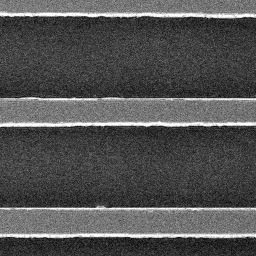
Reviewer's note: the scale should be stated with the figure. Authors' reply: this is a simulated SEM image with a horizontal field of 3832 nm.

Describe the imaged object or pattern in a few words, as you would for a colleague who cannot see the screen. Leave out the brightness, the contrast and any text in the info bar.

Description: lines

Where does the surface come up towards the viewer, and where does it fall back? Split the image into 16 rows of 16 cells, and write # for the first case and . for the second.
################
................
................
................
................
................
################
################
................
................
................
................
................
################
################
................